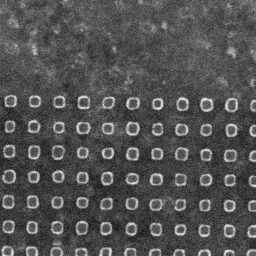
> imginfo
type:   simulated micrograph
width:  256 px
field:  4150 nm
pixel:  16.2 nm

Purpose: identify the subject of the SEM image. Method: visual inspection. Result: a regular array of raised bodies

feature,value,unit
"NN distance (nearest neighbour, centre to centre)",393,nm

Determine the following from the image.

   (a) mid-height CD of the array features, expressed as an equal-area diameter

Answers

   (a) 11.6 pixels